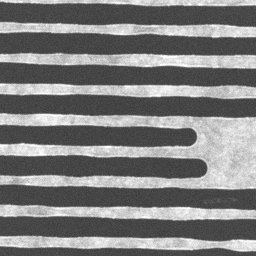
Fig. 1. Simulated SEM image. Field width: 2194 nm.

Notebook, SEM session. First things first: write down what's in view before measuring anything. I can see groups of lines, slits or small figures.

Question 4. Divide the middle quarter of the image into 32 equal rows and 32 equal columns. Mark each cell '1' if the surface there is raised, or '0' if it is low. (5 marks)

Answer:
00000000000000000000000000000000
00000000000000000000000000000000
00000000000000000000000000000000
00000000000000000000000000000000
00000000000000000000000000000000
11000111111110000111111111100000
11111111111111111111111111111111
00000000000011111111111111111111
00000000000000000000000000000000
00000000000000000000000000000000
00000000000000000000000000000000
00000000000000000000000000000000
00000000000000000000000000000000
11111111111111111111111111111111
11111111111111111111111111111111
00000000000000000000001111111111
00000000000000000000000000000000
00000000000000000000000000000000
00000000000000000000000000000000
00000000000000000000000000000000
00000000000000000000000000000000
11111111111111111111111111111111
11111111111111111111111111111111
00000000000000000000000000000000
00000000000000000000000000000000
00000000000000000000000000000000
00000000000000000000000000000000
00000000000000000000000000000000
11111111111111111111111000000000
11111111111111111111111111111111
00000000001111111111111111111111
00000000000000000000000000000000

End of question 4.